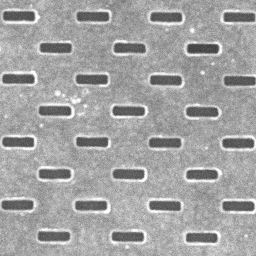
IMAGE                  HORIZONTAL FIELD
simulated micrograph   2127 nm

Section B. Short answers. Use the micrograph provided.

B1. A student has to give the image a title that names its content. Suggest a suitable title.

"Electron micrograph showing a regular array of holes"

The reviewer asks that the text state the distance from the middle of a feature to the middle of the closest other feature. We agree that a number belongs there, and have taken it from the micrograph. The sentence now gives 398 nanometers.